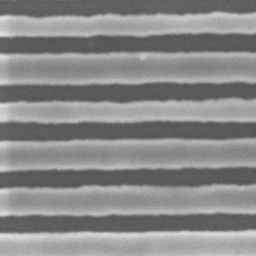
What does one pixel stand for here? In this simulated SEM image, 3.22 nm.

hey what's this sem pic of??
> lines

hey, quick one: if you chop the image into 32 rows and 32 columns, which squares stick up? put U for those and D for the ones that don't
DDDDDDDDDDDDDDDDDDDDDDDDDDDDDDDD
DDDDDDDDDDDDDDDDDDDDDDDDDDDDDDDD
UUUUUUUUUUUUUUUUUUUUUUUUUUUUUUUU
UUUUUUUUUUUUUUUUUUUUUUUUUUUUUUUU
UUDUUUUDDUUDDDDDDUDDDDDDDDDDDDDD
DDDDDDDDDDDDDDDDDDDDDDDDDDDDDDDD
DDDDDDDDDDDDDDDDDDDDDDDDDDDDDDDD
UUUUUUUUUUUUUUUUUUUUUUUUUUUUUUUU
UUUUUUUUUUUUUUUUUUUUUUUUUUUUUUUU
UUUUUUUUUUUUUUUUUUUUUUUUUUUUUUUU
UUDDDDUUUUUDDDDDDDDDDDDDDDDDDDDD
DDDDDDDDDDDDDDDDDDDDDDDDDDDDDDDD
DDDDDDDDDDDDDDDDDDDDDDDDDDDDDUDD
UUUUUUUUUUUUUUUUUUUUUUUUUUUUUUUU
UUUUUUUUUUUUUUUUUUUUUUUUUUUUUUUU
DDDDDDDDDDDDDDDDDDDDDDDDDDDDDDDD
DDDDDDDDDDDDDDDDDDDDDDDDDDDDDDDD
DDDDDDDDDDDDDDDDDUDDUUUDDDDDUUUU
UUUUUUUUUUUUUUUUUUUUUUUUUUUUUUUU
UUUUUUUUUUUUUUUUUUUUUUUUUUUUUUUU
UUUUUUUUUUUUUUUUUUUUUUUUUUUUUUUU
DDDDDDDDDDDDDDDDDDDDDDDDDDDDDDDD
DDDDDDDDDDDDDDDDDDDDDDDDDDDDDDDD
DDDDDDDDDDUUUUUUUUUDDDDDDUUUUUUU
UUUUUUUUUUUUUUUUUUUUUUUUUUUUUUUU
UUUUUUUUUUUUUUUUUUUUUUUUUUUUUUUU
UUUUUUUUUUUUUUUUUUUUUUUUUUUDUUUU
DDDDDDDDDDDDDDDDDDDDDDDDDDDDDDDD
DDDDDDDDDDDDDDDDDDDDDDDDDDDDDDDD
UUUUUUUUUUUUUUUUUUUUUUUUUUUUUUUU
UUUUUUUUUUUUUUUUUUUUUUUUUUUUUUUU
UUUUUUUUUUUUUUUUUUUUUUUUUUUUUUUU